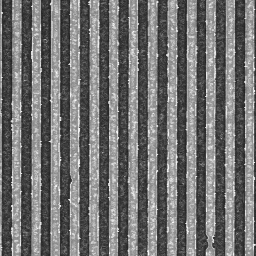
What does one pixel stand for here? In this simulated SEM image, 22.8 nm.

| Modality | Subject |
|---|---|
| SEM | parallel lines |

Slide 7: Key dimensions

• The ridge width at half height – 202 nanometres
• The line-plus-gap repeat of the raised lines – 443 nanometres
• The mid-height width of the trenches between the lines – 242 nm